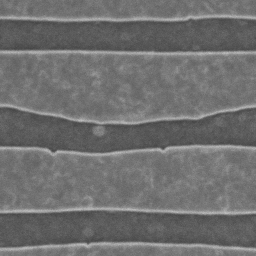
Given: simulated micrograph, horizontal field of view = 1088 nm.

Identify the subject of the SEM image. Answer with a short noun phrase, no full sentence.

one or a few lines or trenches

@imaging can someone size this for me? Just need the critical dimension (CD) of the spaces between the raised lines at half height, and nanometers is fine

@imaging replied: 141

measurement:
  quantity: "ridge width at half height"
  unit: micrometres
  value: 0.271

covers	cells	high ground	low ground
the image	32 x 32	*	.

********************************
********************************
.............****...**..........
................................
................................
................................
......*****.....................
********************************
********************************
********************************
********************************
********************************
********************************
..*****************************.
.......*******************......
............*...................
............*...................
................................
.....................***********
********************************
********************************
********************************
********************************
********************************
********************************
********************************
*....................***********
................................
................................
................................
............*******.............
********************************